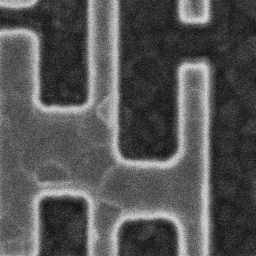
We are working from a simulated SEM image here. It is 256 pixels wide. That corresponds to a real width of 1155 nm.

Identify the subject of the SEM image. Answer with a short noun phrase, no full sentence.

one or a few lines or trenches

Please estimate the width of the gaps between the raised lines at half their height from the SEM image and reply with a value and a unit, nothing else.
257 nm